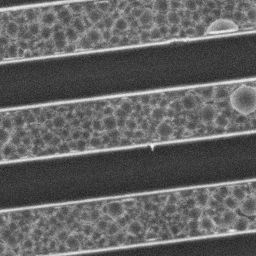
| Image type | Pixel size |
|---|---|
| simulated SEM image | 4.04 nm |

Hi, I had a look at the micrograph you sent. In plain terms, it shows one or a few lines or trenches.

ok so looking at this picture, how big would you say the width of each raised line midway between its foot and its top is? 212 nm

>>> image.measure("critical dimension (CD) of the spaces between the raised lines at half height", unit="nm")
189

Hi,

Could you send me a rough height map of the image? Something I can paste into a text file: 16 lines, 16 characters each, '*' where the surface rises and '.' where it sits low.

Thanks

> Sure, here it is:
.***************
****************
************....
****............
................
...........*****
...*************
****************
**************..
*****...........
................
..............**
......**********
****************
***************.
********........